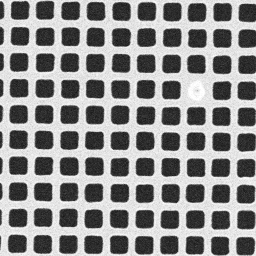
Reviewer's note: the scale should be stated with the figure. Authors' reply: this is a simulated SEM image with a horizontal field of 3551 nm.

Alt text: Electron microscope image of a regular array of holes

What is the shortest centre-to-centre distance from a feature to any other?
0.349 micrometres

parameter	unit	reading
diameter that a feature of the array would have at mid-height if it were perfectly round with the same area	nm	288